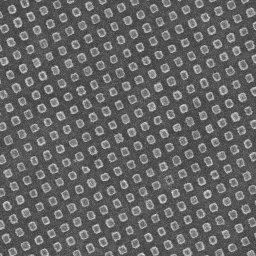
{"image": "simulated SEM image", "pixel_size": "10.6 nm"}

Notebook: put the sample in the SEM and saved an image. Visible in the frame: a regular array of raised bodies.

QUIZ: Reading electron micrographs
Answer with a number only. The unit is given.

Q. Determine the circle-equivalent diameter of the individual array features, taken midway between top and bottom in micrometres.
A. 0.0861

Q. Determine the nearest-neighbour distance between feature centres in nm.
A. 150